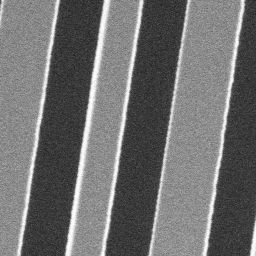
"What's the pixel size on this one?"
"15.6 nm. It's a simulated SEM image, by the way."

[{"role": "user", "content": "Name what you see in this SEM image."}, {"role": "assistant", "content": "lines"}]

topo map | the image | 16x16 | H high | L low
HHHHLLLHHLLLHHHL
HHHLLLHHHLLLHHHL
HHHLLLHHHLLHHHHL
HHHLLLHHLLLHHHHL
HHHLLLHHLLLHHHHL
HHHLLLHHLLLHHHLL
HHHLLLHHLLLHHHLL
HHHLLHHHLLLHHHLL
HHLLLHHHLLHHHHLL
HHLLLHHLLLHHHHLL
HHLLLHHLLLHHHHLL
HHLLLHHLLLHHHHLL
HHLLLHHLLLHHHLLL
HHLLLHHLLLHHHLLL
HLLLHHHLLLHHHLLL
HLLLHHHLLHHHHLLL